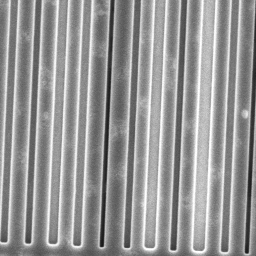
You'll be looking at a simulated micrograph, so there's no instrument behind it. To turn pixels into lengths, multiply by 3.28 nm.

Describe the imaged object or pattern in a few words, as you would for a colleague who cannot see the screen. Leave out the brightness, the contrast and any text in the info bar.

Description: parallel lines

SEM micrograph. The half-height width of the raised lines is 54.1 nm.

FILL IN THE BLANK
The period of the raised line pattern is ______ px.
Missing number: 24.5